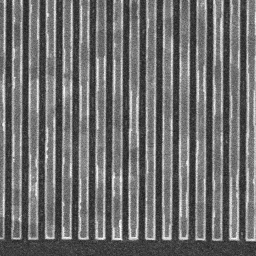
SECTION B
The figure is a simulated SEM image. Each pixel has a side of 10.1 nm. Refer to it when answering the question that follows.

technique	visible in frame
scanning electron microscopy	parallel lines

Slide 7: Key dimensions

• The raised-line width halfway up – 0.0897 um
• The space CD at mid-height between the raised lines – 79.6 nanometers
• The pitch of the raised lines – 169 nm